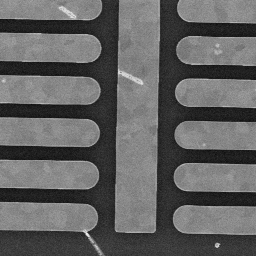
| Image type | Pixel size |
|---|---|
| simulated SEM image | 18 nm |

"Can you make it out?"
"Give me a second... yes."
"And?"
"groups of lines, slits or small figures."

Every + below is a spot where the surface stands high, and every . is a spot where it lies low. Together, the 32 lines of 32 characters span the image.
+++++++++++++..+++++..++++++++++
++++++++++++...+++++..++++++++++
...............+++++...+++++++++
...............+++++............
++++++++++++...+++++............
++++++++++++...+++++..++++++++++
+++++++++++++..+++++..++++++++++
++++++++++++...+++++...+++++++++
...............+++++............
...............+++++............
++++++++++++...+++++..++++++++++
++++++++++++...+++++..++++++++++
++++++++++++...+++++..++++++++++
...............+++++............
...............+++++............
++++++++++++...+++++...+++++++++
++++++++++++...+++++..++++++++++
++++++++++++...+++++..++++++++++
...............+++++...+++++++++
...............+++++............
++++++++++++...+++++...++.......
++++++++++++...+++++..++++++++++
++++++++++++..++++++..++++++++++
......+++++...++++++...+++++++++
..............++++++............
++++++++++....++++++............
++++++++++++..+++++...++++++++++
++++++++++++..+++++...++++++++++
++++++++++++..+++++...++++++++++
................................
................................
................................